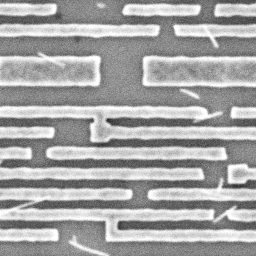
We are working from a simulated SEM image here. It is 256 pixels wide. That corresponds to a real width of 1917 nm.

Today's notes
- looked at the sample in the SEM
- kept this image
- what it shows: wiring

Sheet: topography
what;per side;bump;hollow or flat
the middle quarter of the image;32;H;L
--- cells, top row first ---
HHHHHHHHHLLLLLLLLLLLHHHHHHHHHHHH
HHHHHHHHHLLLLLLLLLLLHHHHHHHHHHHH
HHHHHHHHHLLLLLLLLLLLHHHHHHHHHHHH
HHHHHHHHHLLLLLLLLLLLHHHHHHHHHHHH
HHHHHHHHHLLLLLLLLLLLHHHHHHHHHHHH
LLLLLLLLLLLLLLLLLLLLLLLLLLLLLLLL
LLLLLLLLLLLLLLLLLLLLLLLLLLLLLLLL
LLLLLLLLLLLLLLLLLLLLLLLLLLLLLLLL
LLLLLLLLLLLLLLLLLLLLLLLLLLLLLLLL
LLLLLLLLLLLLLLLLLLLLLLLLLLLLLLLL
LLLLLLLLLLLLLLLLLLLLLLLLLLLLLLLL
HHHHHHHHHHHHHHHHHHHHHHHHHHHHHHHH
HHHHHHHHHHHHHHHHHHHHHHHHHHHHHHHH
LLLLLLLHHHHLLLLLLLLLLLLLLLLLLLLH
LLLLLLLLHHLLLLLLLLLLLLLLLLLLLLLL
LLLLLLLHHHHHLLLLLLLLLLLLLLLLLLLL
LLLLLLLHHHHHHHHHHHHHHHHHHHHHHHHH
LLLLLLLHHHHHHHHHHHHHHHHHHHHHHHHH
LLLLLLLHHHHHLLLLLLLLHHLLLLLLLLLL
LLLLLLLLLLLLLLLLLLLLLLLLLLLLLLLL
LLLLLLLLLLLLLLLLLLLLLLLLLLLLLLLL
HHHHHHHHHHHHHHHHHHHHHHHHHHHHHHHH
HHHHHHHHHHHHHHHHHHHHHHHHHHHHHHHH
HHHHHHLHHHHHHHHHHHHHHHHHHHHHHHHH
LLLLLLLLLLLLLLLLLLLLLLLLLLLLLLLL
LLLLLLLLLLLLLLLLLLLLLLLLLLLLLLLL
HHHHHLHHHHHHHHHHHLHHHHHHHHLHHHHH
HHHHHHHHHHHHHHHHHHHHHHHHHHHHHHHH
HHHHLLLLHHHHHHHHHHHHHHHHHHHHHHHH
LLLLLLLLLLLLLLLLLLLLLLLLLLLLLLLL
LLLLLLLLLLLLLLLLLLLLLLLLLLLLLLLL
HHHHHHHHHHHHHHHHLLLLLLLHHHHHHHHH